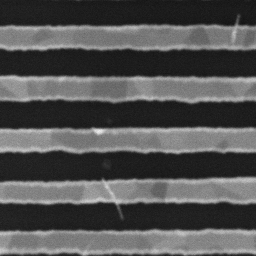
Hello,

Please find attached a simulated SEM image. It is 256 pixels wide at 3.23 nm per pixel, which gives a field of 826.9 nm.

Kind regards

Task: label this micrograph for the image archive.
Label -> lines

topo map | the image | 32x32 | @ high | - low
--------------------------------
--------------------------------
--------------------------------
@@@@@@@@@@@@@@@@@@@@@@@@@@@@@@@@
@@@@@@@@@@@@@@@@@@@@@@@@@@@@@@@@
@@@@@@@@@@@@@@@@@@@@@@@@@@@@@@@@
--------------------------------
--------------------------------
--------------------------------
--------------------------------
@@@@@@@@@@@@@@@@@@@@@@@@@@@@@@@@
@@@@@@@@@@@@@@@@@@@@@@@@@@@@@@@@
@@@@-@---@@-@@@@@---@-@@@@@@@@@@
--------------------------------
--------------------------------
--------------------------------
@@@@@@@@@@@@@@@@@@@@@@@@@@@@@@@@
@@@@@@@@@@@@@@@@@@@@@@@@@@@@@@@@
@@@@@@@@@@@@@@@@@@@@@@@@@@@@@@@@
--------------------------------
--------------------------------
--------------------------------
----------------@-@---@--@@@@@@@
@@@@@@@@@@@@@@@@@@@@@@@@@@@@@@@@
@@@@@@@@@@@@@@@@@@@@@@@@@@@@@@@@
--------------------------------
--------------------------------
--------------------------------
--------------------------------
@@@@@@@@@@@@@@@@@@@@@@@@@@@@@@@@
@@@@@@@@@@@@@@@@@@@@@@@@@@@@@@@@
@@@@@@@@@@@@@@@@@@@@@@@@@@@@@@@@